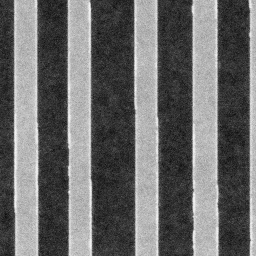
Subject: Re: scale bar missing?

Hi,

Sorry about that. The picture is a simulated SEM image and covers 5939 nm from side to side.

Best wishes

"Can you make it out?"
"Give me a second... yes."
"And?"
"lines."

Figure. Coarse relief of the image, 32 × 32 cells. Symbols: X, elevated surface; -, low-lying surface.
--XXX----XX------XXX----XXX----X
--XXX----XX------XXX----XXX----X
--XXX----XX------XXX----XXX----X
--XXX----XX------XXX----XXX----X
--XXX----XX------XXX----XXX----X
--XXX----XX------XXX----XXX----X
--XXX----XX------XXX----XXX----X
--XXX----XX------XXX----XXX----X
--XXX----XX------XXX----XXX----X
--XXX----XX------XXX----XXX----X
--XXX----XX------XXX----XXX----X
--XXX----XX------XXX----XXX----X
--XXX----XX------XXX----XXX----X
--XXX----XX------XXX----XXX----X
--XXX----XX------XXX----XXX----X
--XXX----XX------XXX----XXX----X
--XXX----XX------XXX----XXX----X
--XXX----XX------XXX----XXX----X
--XXX----XX------XXX----XXX----X
--XXX----XX------XXX----XXX----X
--XXX----XX------XXX----XXX----X
--XXX----XX------XXX----XXX----X
--XXX----XX------XXX----XXX----X
--XXX----XX------XXX----XXX----X
--XXX----XX------XXX----XXX----X
--XXX----XX------XXX----XXX----X
--XXX----XX------XXX----XXX----X
--XXX----XX------XXX----XXX----X
--XXX----XX------XXX----XXX----X
--XXX----XX------XXX----XXX----X
--XXX----XX------XXX----XXX----X
--XXX----XX------XXX----XXX----X